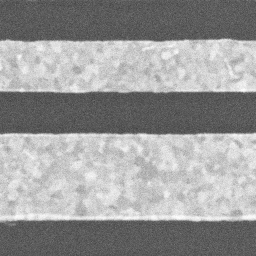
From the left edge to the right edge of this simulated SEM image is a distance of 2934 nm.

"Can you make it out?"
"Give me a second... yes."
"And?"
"lines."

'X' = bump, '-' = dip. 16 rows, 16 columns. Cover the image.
----------------
----------------
-------------XX-
XXXXXXXXXXXXXXXX
XXXXXXXXXXXXXXXX
XXXXXXXXXXXXXXXX
----------------
----------------
XXXXXXXXXXXXXXXX
XXXXXXXXXXXXXXXX
XXXXXXXXXXXXXXXX
XXXXXXXXXXXXXXXX
XXXXXXXXXXXXXXXX
XXXXXXXXXXXXXXXX
----------------
----------------